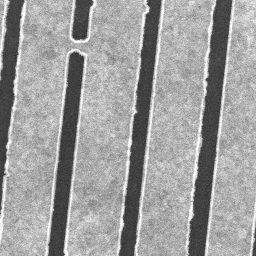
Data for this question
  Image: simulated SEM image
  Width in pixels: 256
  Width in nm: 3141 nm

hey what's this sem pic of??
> one or a few lines or trenches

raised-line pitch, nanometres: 846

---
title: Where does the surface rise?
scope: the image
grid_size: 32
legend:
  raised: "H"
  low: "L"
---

HLLHHHHHHLLLHHHHHHLLHHHHHHHLLHHH
HLLHHHHHHLLHHHHHHHLLHHHHHHHLLHHH
LLLHHHHHHLLHHHHHHHLLHHHHHHLLLHHH
LLLHHHHHHLLHHHHHHHLLHHHHHHLLLHHH
LLLHHHHHHLLHHHHHHHLLHHHHHHLLLHHH
LLLHHHHHHHHHHHHHHHLLHHHHHHLLLHHH
LLHHHHHHHLHHHHHHHHLLHHHHHHLLLHHH
LLHHHHHHLLLHHHHHHLLLHHHHHHLLHHHH
LLHHHHHHLLLHHHHHHLLLHHHHHHLLHHHH
LLHHHHHHLLLHHHHHHLLHHHHHHHLLHHHH
LLHHHHHHLLHHHHHHHLLHHHHHHHLLHHHH
LLHHHHHHLLHHHHHHHLLHHHHHHHLLHHHH
LLHHHHHHLLHHHHHHHLLHHHHHHLLLHHHH
LLHHHHHHLLHHHHHHHLLHHHHHHLLLHHHH
LLHHHHHHLLHHHHHHHLLHHHHHHLLLHHHH
LHHHHHHHLLHHHHHHLLLHHHHHHLLLHHHH
LHHHHHHLLLHHHHHHLLLHHHHHHLLHHHHH
LHHHHHHLLLHHHHHHLLLHHHHHHLLHHHHH
LHHHHHHLLLHHHHHHLLHHHHHHHLLHHHHH
LHHHHHHLLHHHHHHHLLHHHHHHHLLHHHHH
LHHHHHHLLHHHHHHHLLHHHHHHLLLHHHHH
LHHHHHHLLHHHHHHHLLHHHHHHLLLHHHHH
LHHHHHHLLHHHHHHHLLHHHHHHLLLHHHHH
LHHHHHHLLHHHHHHHLLHHHHHHLLLHHHHH
HHHHHHHLLHHHHHHLLLHHHHHHLLLHHHHH
HHHHHHLLLHHHHHHLLLHHHHHHLLLHHHHH
HHHHHHLLLHHHHHHLLLHHHHHHLLHHHHHH
HHHHHHLLLHHHHHHLLLHHHHHHLLHHHHHH
HHHHHHLLHHHHHHHLLHHHHHHHLLHHHHHH
HHHHHHLLHHHHHHHLLHHHHHHLLLHHHHHH
HHHHHHLLHHHHHHHLLHHHHHHLLLHHHHHL
HHHHHHLLHHHHHHHLLHHHHHHLLLHHHHHL